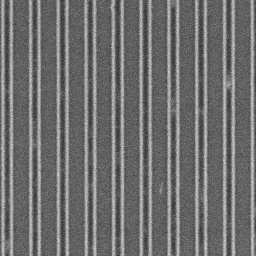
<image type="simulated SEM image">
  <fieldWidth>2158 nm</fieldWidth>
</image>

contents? parallel lines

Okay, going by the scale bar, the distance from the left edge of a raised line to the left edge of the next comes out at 0.234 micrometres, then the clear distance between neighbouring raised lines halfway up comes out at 18.5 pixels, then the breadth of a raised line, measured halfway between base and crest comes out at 78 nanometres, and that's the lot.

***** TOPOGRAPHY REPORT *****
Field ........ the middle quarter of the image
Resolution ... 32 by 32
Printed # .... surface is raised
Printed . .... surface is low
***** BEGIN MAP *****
#....###....##.....##.....##....
#....###....##.....##.....##....
#....###....##.....##.....##....
#....###....##.....##.....##....
#....###....##.....##.....##....
#....###....##.....##.....##....
#....###....##.....##.....##....
#....###....##.....##.....##....
#....###....##.....##.....##....
#....###....##.....##.....##....
#....###....##.....##.....##....
#....###....##.....##.....##....
#....###....##.....##.....##....
#....###....##.....##.....##....
#....###....##.....##.....##....
#.....##....##.....##.....###...
#.....##....##.....##.....##....
#.....##....##.....##.....##....
#.....##....##.....##.....##....
#.....##....##.....##.....##....
#.....##....###....###....##....
#.....##....###....###....##....
#.....##....###....###....##....
#.....##....###....###....##....
#.....##....###....##.....##....
#.....##....###....##.....##....
#.....##....###....###....##....
#.....##....###....###....##....
#.....##....###....###....##....
#.....##....###....##.....##....
#.....##....###....##.....##....
#.....##....###....##.....##....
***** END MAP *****